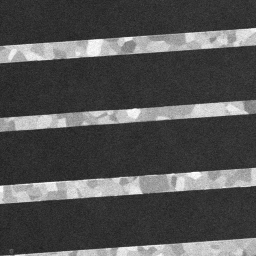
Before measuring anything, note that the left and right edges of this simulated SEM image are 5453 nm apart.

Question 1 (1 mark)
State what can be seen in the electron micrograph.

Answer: one or a few lines or trenches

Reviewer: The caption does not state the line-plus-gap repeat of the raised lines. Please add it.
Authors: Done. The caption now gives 69.9 pixels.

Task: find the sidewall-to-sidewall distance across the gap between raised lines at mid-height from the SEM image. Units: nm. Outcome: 1160